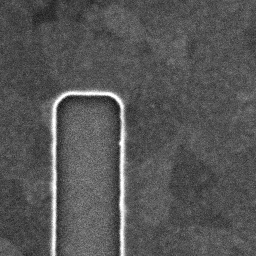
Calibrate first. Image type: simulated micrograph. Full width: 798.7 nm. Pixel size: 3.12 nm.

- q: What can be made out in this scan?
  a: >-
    one or a few lines or trenches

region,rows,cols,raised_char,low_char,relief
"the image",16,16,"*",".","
****************
****************
****************
****************
****************
****************
****...*********
***.....********
***.....********
***.....********
***.....********
***.....********
***.....********
***.....********
***.....********
***.....********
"